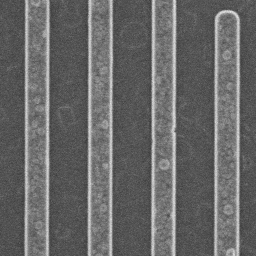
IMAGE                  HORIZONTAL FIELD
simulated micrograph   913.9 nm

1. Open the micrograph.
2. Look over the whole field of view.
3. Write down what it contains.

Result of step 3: parallel lines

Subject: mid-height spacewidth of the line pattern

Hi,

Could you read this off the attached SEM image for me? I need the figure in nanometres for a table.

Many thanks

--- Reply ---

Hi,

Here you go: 149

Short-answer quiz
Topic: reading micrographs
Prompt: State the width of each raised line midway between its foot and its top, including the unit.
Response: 78.2 nanometers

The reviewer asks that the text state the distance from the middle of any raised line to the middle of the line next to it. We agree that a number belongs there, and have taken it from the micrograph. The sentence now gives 226 nm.